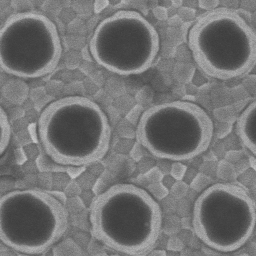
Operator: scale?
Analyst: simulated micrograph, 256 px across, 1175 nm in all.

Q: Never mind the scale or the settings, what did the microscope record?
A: raised bodies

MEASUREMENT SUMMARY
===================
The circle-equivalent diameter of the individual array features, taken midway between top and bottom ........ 285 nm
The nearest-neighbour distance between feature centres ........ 457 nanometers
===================